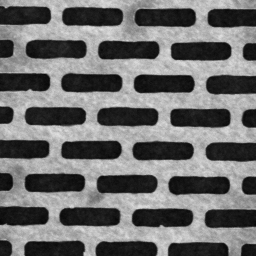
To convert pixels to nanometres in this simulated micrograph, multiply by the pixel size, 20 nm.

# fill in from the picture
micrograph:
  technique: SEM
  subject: a regular array of holes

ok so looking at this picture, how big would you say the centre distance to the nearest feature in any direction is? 979 nm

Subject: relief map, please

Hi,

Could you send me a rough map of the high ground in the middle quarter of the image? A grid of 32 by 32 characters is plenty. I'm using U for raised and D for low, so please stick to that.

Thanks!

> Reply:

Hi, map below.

UUUUUUUUUUUUUUUUUUUUUUUUUUUUUUUU
UUUUUUUUUUUUUUUUUUUUUUUUUUUUUUUU
UDDDDDDDDDDDDUUUUUUUUUUUUUUUUUUU
DDDDDDDDDDDDDDUUUUDDDDDDDDDDDDDD
DDDDDDDDDDDDDDDUUUDDDDDDDDDDDDDD
DDDDDDDDDDDDDDDUUDDDDDDDDDDDDDDD
DDDDDDDDDDDDDDUUUUDDDDDDDDDDDDDD
UUUUUUUUUUUUUUUUUUUUUUUUUUUUUUUU
UUUUUUUUUUUUUUUUUUUUUUUUUUUUUUUU
UUUUUUUUUUUUUUUUUUUUUUUUUUUUUUUU
UUUUUUUUUUUUUUUUUUUUUUUUUUUUUUUU
DDDDDUUUUDDDDDDDDDDDDDDUUUUDDDDD
DDDDDDUUDDDDDDDDDDDDDDDDUUDDDDDD
DDDDDDUUDDDDDDDDDDDDDDDUUUDDDDDD
DDDDDUUUDDDDDDDDDDDDDDDUUUUDDDDD
DUUUUUUUUUUDUUUUDDDDDDUUUUUDDDDD
UUUUUUUUUUUUUUUUUUUUUUUUUUUUUUUU
UUUUUUUUUUUUUUUUUUUUUUUUUUUUUUUU
UUUUUUUUUUUUUUUUUUUUUUUUUUUUUUUU
DDDDDDDDDDDDDDUUUUDDDDDDDDDDUUUU
DDDDDDDDDDDDDDUUUDDDDDDDDDDDDDDD
DDDDDDDDDDDDDDDUUDDDDDDDDDDDDDDD
DDDDDDDDDDDDDDUUUDDDDDDDDDDDDDDD
DDDDDDDDDDDDDUUUUUDDDDDDDDDDDDDD
UUUUUUUUUUUUUUUUUUUUUUUUUUUUUUUU
UUUUUUUUUUUUUUUUUUUUUUUUUUUUUUUU
UUUUUUUUUUUUUUUUUUUUUUUUUUUUUUUU
DDDDUUUUUUUUUUUUUUUUUUUUUUUUUUUU
DDDDDUUUDDDDDDDDDDDDDDDUUUUDDDDD
DDDDDUUUDDDDDDDDDDDDDDDUUUDDDDDD
DDDDDUUUDDDDDDDDDDDDDDDUUUDDDDDD
DDDDUUUUDDDDDDDDDDDDDDDUUUDDDDDD